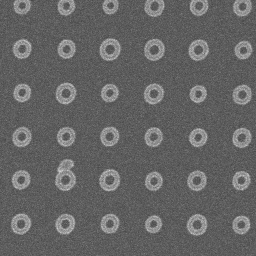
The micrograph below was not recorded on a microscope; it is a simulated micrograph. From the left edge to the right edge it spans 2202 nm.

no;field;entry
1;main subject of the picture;a regular array of ring-shaped raised bodies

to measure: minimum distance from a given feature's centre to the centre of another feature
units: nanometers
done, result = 373